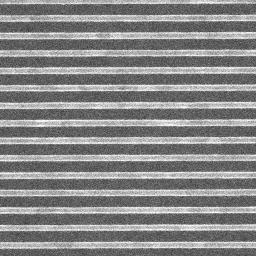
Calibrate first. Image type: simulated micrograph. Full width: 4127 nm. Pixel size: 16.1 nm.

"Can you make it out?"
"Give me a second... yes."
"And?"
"parallel lines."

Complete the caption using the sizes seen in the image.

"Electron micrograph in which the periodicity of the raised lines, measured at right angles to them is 281 nm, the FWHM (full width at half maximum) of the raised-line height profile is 5.75 pixels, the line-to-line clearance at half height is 0.185 um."